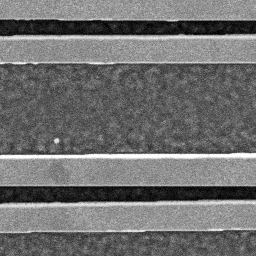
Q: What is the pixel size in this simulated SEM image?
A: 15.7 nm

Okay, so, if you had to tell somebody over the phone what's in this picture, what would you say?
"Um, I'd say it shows lines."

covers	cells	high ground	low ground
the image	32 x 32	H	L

HHHHHHHHHHHHHHHHHHHHHHHHHHHHHHHH
HHHHHHHHHHHHHHHHHHHHHHHHHHHHHHHH
LLLLLLLLLLLLLLLLLLLLHHHLLLLLLLLL
LLLLLLLLLLLLLLLLLLLLLLLLLLLLLLLL
LLLLLLLLLLLLLLLLLLLLLHHHHHHHHHHH
HHHHHHHHHHHHHHHHHHHHHHHHHHHHHHHH
HHHHHHHHHHHHHHHHHHHHHHHHHHHHHHHH
HHHHHHHHHHHHHHHHHHHHHHHHHHHHHHHH
LLLLLLLLLLLLLLLLLLLLLLLLLLLLLLLL
LLLLLLLLLLLLLLLLLLLLLLLLLLLLLLLL
LLLLLLLLLLLLLLLLLLLLLLLLLLLLLLLL
LLLLLLLLLLLLLLLLLLLLLLLLLLLLLLLL
LLLLLLLLLLLLLLLLLLLLLLLLLLLLLLLL
LLLLLLLLLLLLLLLLLLLLLLLLLLLLLLLL
LLLLLLLLLLLLLLLLLLLLLLLLLLLLLLLL
LLLLLLLLLLLLLLLLLLLLLLLLLLLLLLLL
LLLLLLLLLLLLLLLLLLLLLLLLLLLLLLLL
LLLLLLLLLLLLLLLLLLLLLLLLLLLLLLLL
LLLLLLLLLLLLLLLLLLLLLLLLLLLLLLLL
LLLLLLLHHHHHHHHHHHHHHHHHHHHHHHHH
HHHHHHHHHHHHHHHHHHHHHHHHHHHHHHHH
HHHHHHHHHHHHHHHHHHHHHHHHHHHHHHHH
HHHHHHHHHHHHHHHHHHHHHHHHHHHHHHHH
LLLLLLLLLLLLLLLLLLLLLLLLLLLLLLLL
LLLLLLLLLLLLLLLLLLLLLLLLLLLLLLLL
LLLLLLHHHHHHHHHHHHHHHHHHHHHHHHHH
HHHHHHHHHHHHHHHHHHHHHHHHHHHHHHHH
HHHHHHHHHHHHHHHHHHHHHHHHHHHHHHHH
HHHHHHHHHHHHHHHHHHHHHHHHHHHHHHHH
LLLLLLLLLLLLLLLLLLLLLLLLLLLLLLLL
LLLLLLLLLLLLLLLLLLLLLLLLLLLLLLLL
LLLLLLLLLLLLLLLLLLLLLLLLLLLLLLLL